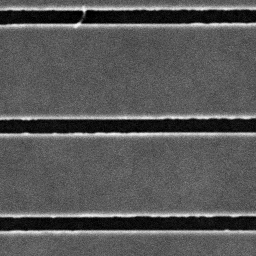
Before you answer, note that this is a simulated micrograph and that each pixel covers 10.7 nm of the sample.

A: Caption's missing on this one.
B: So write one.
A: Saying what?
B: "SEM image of lines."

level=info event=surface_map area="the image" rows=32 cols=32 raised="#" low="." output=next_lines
################################
................................
................................
################################
################################
################################
################################
################################
################################
################################
################################
################################
################################
################################
################################
................................
................................
################################
################################
################################
################################
################################
################################
################################
################################
################################
################################
................................
................................
################################
################################
################################